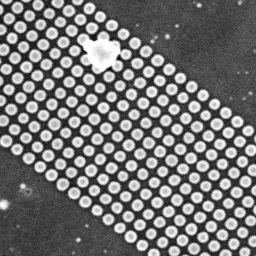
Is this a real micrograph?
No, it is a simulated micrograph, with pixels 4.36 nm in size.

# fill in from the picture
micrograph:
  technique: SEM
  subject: a regular array of raised bodies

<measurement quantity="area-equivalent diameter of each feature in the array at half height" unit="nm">42.9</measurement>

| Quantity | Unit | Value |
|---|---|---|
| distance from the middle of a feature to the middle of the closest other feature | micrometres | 0.0607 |